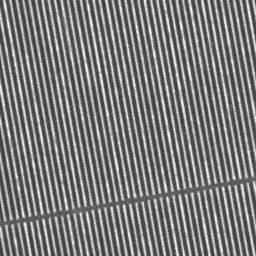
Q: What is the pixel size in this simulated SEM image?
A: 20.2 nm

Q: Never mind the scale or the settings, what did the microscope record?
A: parallel lines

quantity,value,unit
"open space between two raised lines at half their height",99.4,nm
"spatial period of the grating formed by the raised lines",127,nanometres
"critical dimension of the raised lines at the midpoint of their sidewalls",1.97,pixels